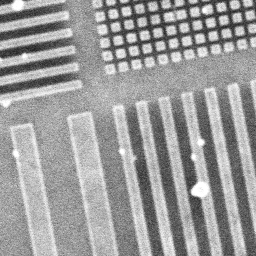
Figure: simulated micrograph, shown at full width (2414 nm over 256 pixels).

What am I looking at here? groups of lines, slits or small figures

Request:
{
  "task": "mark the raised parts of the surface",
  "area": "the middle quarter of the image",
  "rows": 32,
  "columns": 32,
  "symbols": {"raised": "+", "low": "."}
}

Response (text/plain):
+++........+..++.++.............
+++.......+++.+.................
................................
................................
.+++............................
++++............................
+...............................
..............................++
..............................++
........................++....++
..................+++...+++...++
.............++...+++...+++...++
.....++......++....++...+++...++
.++++++......++....++....++....+
.++++++......++....++....++....+
.++++++......+++...++....++....+
..+++++......+++...+++...+++...+
..++++++......++....++....++...+
..++++++......++....++....++....
..++++++......++....++....++....
..++++++......+++...+++...++....
...++++++.....+++...+++...+++...
...++++++.....+++...+++...+++...
...++++++......++....++....++...
...++++++......++....++....++...
...++++++......++....++....++...
...++++++......+++...+++...+++..
....++++++......++....++...+++..
....++++++......++....++...+++..
....++++++......++....++....++..
....++++++......++....++....++..
.....+++++......+++...+++...++..